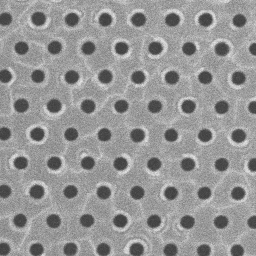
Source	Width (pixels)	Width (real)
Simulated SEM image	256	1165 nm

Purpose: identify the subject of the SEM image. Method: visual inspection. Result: a regular array of holes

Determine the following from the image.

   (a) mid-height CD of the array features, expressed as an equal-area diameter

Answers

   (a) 60.9 nanometres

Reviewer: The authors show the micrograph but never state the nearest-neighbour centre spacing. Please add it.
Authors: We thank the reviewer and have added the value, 150 nanometres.